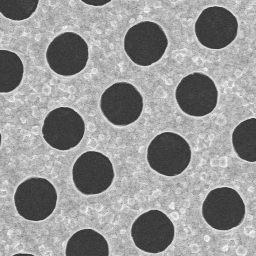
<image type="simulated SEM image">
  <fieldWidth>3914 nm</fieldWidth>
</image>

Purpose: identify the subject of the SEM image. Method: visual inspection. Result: a regular array of holes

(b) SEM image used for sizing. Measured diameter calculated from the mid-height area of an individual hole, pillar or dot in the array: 654 nanometres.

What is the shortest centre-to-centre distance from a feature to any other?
1 um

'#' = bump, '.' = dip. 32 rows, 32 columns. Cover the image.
.....######..###################
....#####################....###
##.######################.....##
################....####......##
#######...######.....####.....##
######.....####......####....###
..####.....#####.....###########
...###.....#####....############
...###....######################
...####################...######
..############..######.....#####
.############....#####.....#####
#############.....####.....#####
#######..####.....#####....#####
######....###....###############
#####......###..##############..
#####......##################...
######....#########....######...
#######..##########.....#####...
##########...#####......######..
#########.....#####.....########
#########.....######...#########
###...###.....##################
##.....###...##############..###
##.....###################....##
##.....##################.....##
##.....###########..#####......#
####.############....#####....##
################......#####..###
#########....###......##########
########.....####....###########
########......####..############